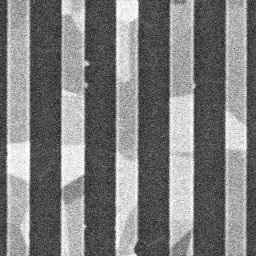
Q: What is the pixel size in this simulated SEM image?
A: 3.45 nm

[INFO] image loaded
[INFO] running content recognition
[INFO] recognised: parallel lines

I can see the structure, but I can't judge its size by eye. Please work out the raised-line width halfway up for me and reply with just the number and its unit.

70.8 nm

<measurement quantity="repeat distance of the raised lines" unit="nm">188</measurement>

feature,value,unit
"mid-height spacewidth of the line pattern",118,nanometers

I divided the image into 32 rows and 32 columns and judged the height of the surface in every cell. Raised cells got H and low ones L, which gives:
LHHLLLLLHHLLLLLHHLLLLHHHLLLLHHHL
LHHLLLLLHHLLLLLHHLLLLHHHLLLLHHHL
LHHLLLLLHHLLLLLHHLLLLHHHLLLLHHHL
LHHLLLLLHHLLLLLHHLLLLHHHLLLLHHHL
LHHLLLLLHHLLLLLHHLLLLHHHLLLLHHHL
LHHLLLLLHHLLLLLHHLLLLHHHLLLLHHHL
LHHLLLLLHHLLLLLHHLLLLHHHLLLLHHHL
LHHLLLLLHHLLLLLHHLLLLHHHLLLLHHHL
LHHLLLLLHHLLLLLHHLLLLHHHLLLLHHHL
LHHLLLLLHHLLLLLHHLLLLHHHLLLLHHHL
LHHLLLLLHHLLLLLHHLLLLHHHLLLLHHHL
LHHLLLLLHHLLLLLHHLLLLHHHLLLLHHHL
LHHLLLLLHHLLLLLHHLLLLHHHLLLLHHHL
LHHLLLLLHHLLLLLHHLLLLHHHLLLLHHHL
LHHLLLLLHHLLLLLHHLLLLHHHLLLLHHHL
LHHLLLLLHHLLLLLHHLLLLHHHLLLLHHHL
LHHLLLLLHHLLLLLHHLLLLHHHLLLLHHHL
LHHLLLLLHHLLLLLHHLLLLHHHLLLLHHHL
LHHLLLLLHHLLLLLHHLLLLHHHLLLLHHHL
LHHLLLLLHHLLLLLHHLLLLHHHLLLLHHHL
LHHLLLLLHHLLLLLHHLLLLHHHLLLLHHHL
LHHLLLLLHHLLLLLHHLLLLHHHLLLLHHHL
LHHLLLLLHHLLLLLHHLLLLHHHLLLLHHHL
LHHLLLLLHHLLLLLHHLLLLHHHLLLLHHHL
LHHLLLLLHHLLLLLHHLLLLHHHLLLLHHHL
LHHLLLLLHHLLLLLHHLLLLHHHLLLLHHHL
LHHLLLLLHHLLLLLHHLLLLHHHLLLLHHHL
LHHLLLLLHHLLLLLHHLLLLHHHLLLLHHHL
LHHLLLLLHHLLLLLHHLLLLHHHLLLLHHHL
LHHLLLLLHHLLLLLHHLLLLHHHLLLLHHHL
LHHLLLLLHHLLLLLHHLLLLHHHLLLLHHHL
LHHLLLLLHHLLLLLHHLLLLHHHLLLLHHHL